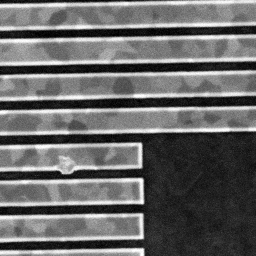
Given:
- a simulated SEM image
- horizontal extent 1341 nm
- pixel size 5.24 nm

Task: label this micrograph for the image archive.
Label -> parallel lines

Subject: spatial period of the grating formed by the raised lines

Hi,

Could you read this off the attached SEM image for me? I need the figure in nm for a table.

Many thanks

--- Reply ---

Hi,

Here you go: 185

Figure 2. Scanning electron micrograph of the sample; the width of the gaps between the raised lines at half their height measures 64.9 nm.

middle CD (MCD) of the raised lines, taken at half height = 120 nanometers